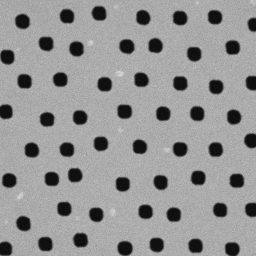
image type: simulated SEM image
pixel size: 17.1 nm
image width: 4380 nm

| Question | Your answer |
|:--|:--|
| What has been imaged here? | a regular array of holes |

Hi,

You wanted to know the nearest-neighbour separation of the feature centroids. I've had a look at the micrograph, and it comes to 0.562 microns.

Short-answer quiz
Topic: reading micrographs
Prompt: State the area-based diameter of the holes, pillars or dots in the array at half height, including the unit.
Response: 0.256 microns